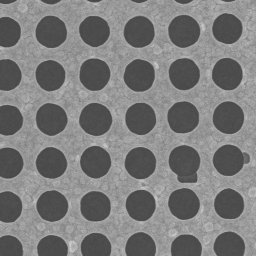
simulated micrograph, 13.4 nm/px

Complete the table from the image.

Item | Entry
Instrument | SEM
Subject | a regular array of holes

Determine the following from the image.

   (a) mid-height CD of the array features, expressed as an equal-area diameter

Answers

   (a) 424 nm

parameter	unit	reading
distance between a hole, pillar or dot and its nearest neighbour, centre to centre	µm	0.577